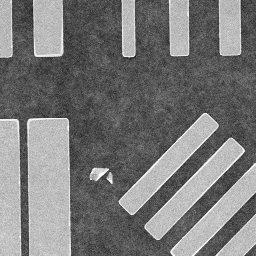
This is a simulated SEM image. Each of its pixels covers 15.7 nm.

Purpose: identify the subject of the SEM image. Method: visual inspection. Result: groups of lines, slits or small figures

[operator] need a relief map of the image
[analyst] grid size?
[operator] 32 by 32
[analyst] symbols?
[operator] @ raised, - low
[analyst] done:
@---@@@@-------@@----@@@---@@@--
@---@@@@-------@@----@@@----@@--
@---@@@@-------@@----@@@----@@--
@---@@@@-------@@----@@@----@@--
@---@@@@-------@@----@@@----@@--
@---@@@@-------@@----@@@----@@--
@---@@@@-------@@----@@@----@@--
--------------------------------
--------------------------------
--------------------------------
--------------------------------
--------------------------------
--------------------------------
--------------------------------
-------------------------@------
@@--@@@@@---------------@@@-----
@@--@@@@@--------------@@@@-----
@@--@@@@@-------------@@@@------
@@--@@@@@------------@@@@---@@--
@@--@@@@@-----------@@@@---@@@--
@@--@@@@@----------@@@@---@@@---
@@--@@@@@--@@-----@@@@---@@@---@
@@--@@@@@--------@@@@---@@@---@@
@@--@@@@@-------@@@@---@@@---@@@
@@--@@@@@------@@@@---@@@---@@@-
@@--@@@@@------@@@---@@@---@@@@-
@@@-@@@@@-------@---@@@---@@@@--
@@@-@@@@@----------@@@---@@@@--@
@@@-@@@@@---------@@@---@@@@--@@
@@@-@@@@@----------@---@@@@--@@@
@@@-@@@@@-------------@@@@--@@@@
@@@-@@@@@-------------@@@--@@@@-